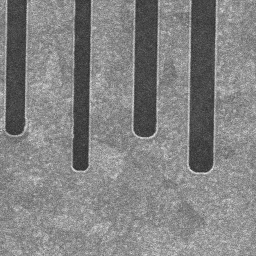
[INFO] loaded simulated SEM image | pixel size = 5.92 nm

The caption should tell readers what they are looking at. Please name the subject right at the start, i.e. one or a few lines or trenches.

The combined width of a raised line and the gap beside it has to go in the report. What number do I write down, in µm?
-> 0.366